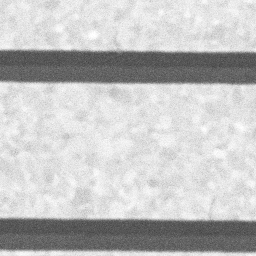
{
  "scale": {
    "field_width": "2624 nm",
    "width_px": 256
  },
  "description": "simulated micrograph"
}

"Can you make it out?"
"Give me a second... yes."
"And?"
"lines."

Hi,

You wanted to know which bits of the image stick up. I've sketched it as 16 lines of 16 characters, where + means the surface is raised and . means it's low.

++++++++++++++++
++++++++++++++++
++++++++++++++++
................
................
++++++++++++++++
++++++++++++++++
++++++++++++++++
++++++++++++++++
++++++++++++++++
++++++++++++++++
++++++++++++++++
++++++++++++++++
++++++++++++++++
................
................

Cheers